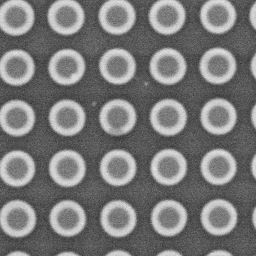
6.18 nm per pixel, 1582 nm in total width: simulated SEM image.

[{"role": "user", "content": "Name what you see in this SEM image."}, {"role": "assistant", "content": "an array of small figures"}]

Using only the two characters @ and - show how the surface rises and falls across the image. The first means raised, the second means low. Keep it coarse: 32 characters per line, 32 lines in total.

-@@@---@@@---@@@---@@@@---@@@---
@@@@--@@@@--@@@@@--@@@@--@@@@--@
@@@@--@@@@--@@@@@--@@@@--@@@@--@
@@@@---@@@---@@@---@@@----@@@---
--------------------------------
--------------------------------
-@@----@@----@@@----@@----@@@---
@@@@--@@@@---@@@@--@@@@--@@@@---
@@@@--@@@@@-@@@@@--@@@@--@@@@--@
@@@@--@@@@---@@@@--@@@@--@@@@---
-@@-----@-----------------------
--------------------------------
---------------------------@----
@@@@---@@@---@@@@--@@@@--@@@@---
@@@@--@@@@@--@@@@--@@@@--@@@@---
@@@@--@@@@---@@@@--@@@@--@@@@---
-@@----@@@---@@@----@@----@@----
--------------------------------
--------------------------------
-@@@---@@@---@@@---@@@@---@@@---
@@@@--@@@@@--@@@@--@@@@--@@@@---
@@@@--@@@@@--@@@@--@@@@--@@@@---
@@@@---@@@---@@@----@@@---@@@---
--------------------------------
--------------------------------
-@@----@@@----@@----@@----@@@---
@@@@--@@@@---@@@@--@@@@--@@@@---
@@@@--@@@@@--@@@@--@@@@--@@@@@--
@@@@---@@@---@@@@--@@@@---@@@---
-@@-----------@-----------------
--------------------------------
--------------@@----@@-----@----